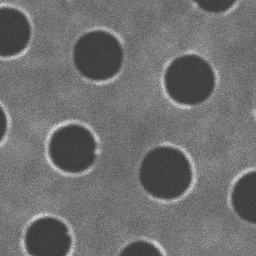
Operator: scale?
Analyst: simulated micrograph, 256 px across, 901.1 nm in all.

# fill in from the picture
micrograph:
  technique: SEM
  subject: holes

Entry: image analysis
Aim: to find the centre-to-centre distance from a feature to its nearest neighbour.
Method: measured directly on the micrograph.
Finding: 335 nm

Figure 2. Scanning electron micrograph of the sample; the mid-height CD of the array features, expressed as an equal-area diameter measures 179 nm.